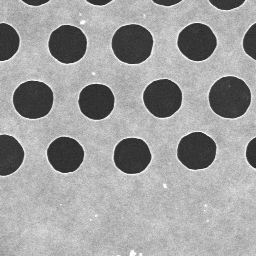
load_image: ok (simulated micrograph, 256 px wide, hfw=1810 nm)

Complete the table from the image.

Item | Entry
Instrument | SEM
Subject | a regular array of holes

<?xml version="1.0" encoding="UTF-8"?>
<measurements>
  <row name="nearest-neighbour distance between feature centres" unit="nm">445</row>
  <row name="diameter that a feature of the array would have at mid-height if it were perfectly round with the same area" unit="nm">274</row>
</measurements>